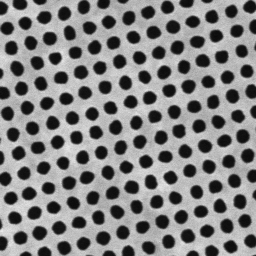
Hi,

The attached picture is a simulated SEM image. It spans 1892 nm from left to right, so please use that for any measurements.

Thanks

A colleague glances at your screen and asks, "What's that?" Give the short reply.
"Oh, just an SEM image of a regular array of holes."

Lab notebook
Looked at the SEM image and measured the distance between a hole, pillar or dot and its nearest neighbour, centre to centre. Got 146 nm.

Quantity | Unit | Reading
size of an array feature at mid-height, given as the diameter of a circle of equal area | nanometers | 101